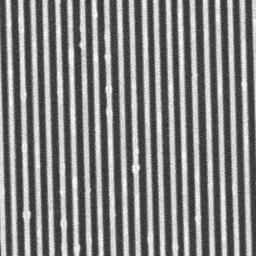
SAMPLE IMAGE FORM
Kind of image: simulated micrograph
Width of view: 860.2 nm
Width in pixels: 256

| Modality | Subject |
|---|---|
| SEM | parallel lines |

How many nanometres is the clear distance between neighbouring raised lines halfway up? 25.2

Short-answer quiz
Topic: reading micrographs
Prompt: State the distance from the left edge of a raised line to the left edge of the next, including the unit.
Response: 41.3 nanometres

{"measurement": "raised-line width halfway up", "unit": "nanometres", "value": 16.8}